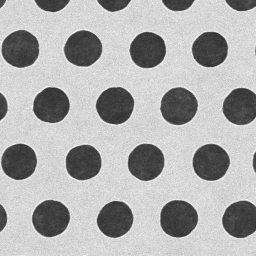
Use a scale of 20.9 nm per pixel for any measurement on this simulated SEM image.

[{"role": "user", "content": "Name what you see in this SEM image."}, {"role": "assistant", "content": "a regular array of holes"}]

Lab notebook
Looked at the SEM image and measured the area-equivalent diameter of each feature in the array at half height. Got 770 nanometers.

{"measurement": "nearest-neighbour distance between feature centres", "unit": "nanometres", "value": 1320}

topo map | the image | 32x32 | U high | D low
DUUUUDDDUUUUDDDDUUUUUDDDUUUUDDDD
UUUUUUUUUUUUUUUUUUUUUUUUUUUUUUUU
UUUUUUUUUUUUUUUUUUUUUUUUUUUUUUUU
UUUUUUUUUUUUUUUUUUUUUUUUUUUUUUUU
UDDDUUUUUDDDUUUUUDDDUUUUUDDDUUUU
DDDDDUUUDDDDDUUUDDDDDUUUDDDDUUUU
DDDDDUUUDDDDDUUUDDDDDUUUDDDDDUUU
UDDDDUUUDDDDUUUUUDDDUUUUDDDDUUUU
UUDUUUUUUUUUUUUUUUDUUUUUUUUUUUUU
UUUUUUUUUUUUUUUUUUUUUUUUUUUUUUUU
UUUUUUUUUUUUUUUUUUUUUUUUUUUUUUUU
UUUUUDDDUUUUUDDDUUUUUDDDUUUUUDDD
DUUUDDDDDUUUDDDDDUUUDDDDDUUUDDDD
DUUUDDDDDUUUDDDDDUUUDDDDDUUUDDDD
DUUUUDDDUUUUDDDDUUUUDDDDUUUUDDDD
UUUUUUUUUUUUUUDUUUUUUUDUUUUUUDDU
UUUUUUUUUUUUUUUUUUUUUUUUUUUUUUUU
UUUUUUUUUUUUUUUUUUUUUUUUUUUUUUUU
UDDDUUUUUDDDUUUUUDDDUUUUUDDDUUUU
DDDDUUUUDDDDDUUUDDDDUUUUDDDDDUUU
DDDDDUUUDDDDDUUUDDDDDUUUDDDDDUUU
UDDDUUUUDDDDUUUUDDDDUUUUDDDDUUUU
UUUUUUUUUUDUUUUUUDDUUUUUUUDUUUUU
UUUUUUUUUUUUUUUUUUUUUUUUUUUUUUUU
UUUUUUUUUUUUUUUUUUUUUUUUUUUUUUUU
UUUUUDDDUUUUUDDDUUUUUDDDUUUUUDDD
DUUUDDDDDUUUDDDDUUUUDDDDDUUUDDDD
DUUUDDDDDUUUDDDDDUUUDDDDDUUUDDDD
DUUUDDDDUUUUDDDDUUUUDDDDUUUUDDDD
UUUUUDDUUUUUUDDUUUUUUDDUUUUUUDDU
UUUUUUUUUUUUUUUUUUUUUUUUUUUUUUUU
UUUUUUUUUUUUUUUUUUUUUUUUUUUUUUUU